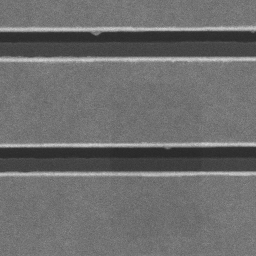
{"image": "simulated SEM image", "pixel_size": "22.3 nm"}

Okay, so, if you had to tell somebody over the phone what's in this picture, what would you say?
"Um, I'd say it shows lines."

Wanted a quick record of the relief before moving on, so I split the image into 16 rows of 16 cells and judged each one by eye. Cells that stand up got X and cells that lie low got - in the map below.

XXXXXXXXXXXXXXXX
XXXXXXXXXXXXXXXX
----------------
----------------
XXXXXXXXXXXXXXXX
XXXXXXXXXXXXXXXX
XXXXXXXXXXXXXXXX
XXXXXXXXXXXXXXXX
XXXXXXXXXXXXXXXX
----------------
----------------
XXXXXXXXXXXXXXXX
XXXXXXXXXXXXXXXX
XXXXXXXXXXXXXXXX
XXXXXXXXXXXXXXXX
XXXXXXXXXXXXXXXX